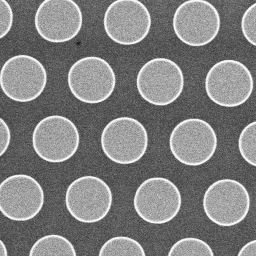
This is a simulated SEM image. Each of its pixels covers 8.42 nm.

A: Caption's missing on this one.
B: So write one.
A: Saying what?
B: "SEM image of an array of small figures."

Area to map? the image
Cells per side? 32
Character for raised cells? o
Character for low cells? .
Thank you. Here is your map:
o....oooo.....oooo.....ooo......
o....ooooo...ooooo....ooooo....o
o...oooooo...oooooo...ooooo...oo
o....ooooo...oooooo...ooooo...oo
.....oooo.....oooo....ooooo....o
...............oo.......oo......
................................
.ooo......ooo......oo...........
ooooo....ooooo....oooo.....oooo.
oooooo...ooooo...oooooo...ooooo.
oooooo...ooooo...oooooo...oooooo
.oooo....ooooo...oooooo...ooooo.
..oo......ooo.....oooo.....oooo.
................................
................................
o....oooo.....ooo.....oooo.....o
o...oooooo...ooooo....ooooo...oo
o...oooooo...ooooo...oooooo...oo
o...oooooo...ooooo...oooooo...oo
.....oooo....ooooo....oooo....oo
.......................oo......o
................................
.ooo......ooo.....ooo.......o...
ooooo....ooooo...ooooo....ooooo.
ooooo...oooooo...oooooo...ooooo.
ooooo...oooooo...oooooo..oooooo.
ooooo....oooo....ooooo....ooooo.
..........oo......ooo......ooo..
................................
......o.........................
....ooooo....oooo.....oooo.....o
o...ooooo....ooooo...ooooo....oo